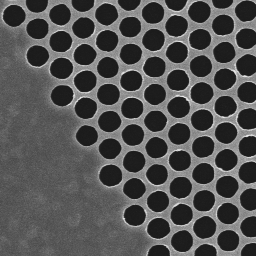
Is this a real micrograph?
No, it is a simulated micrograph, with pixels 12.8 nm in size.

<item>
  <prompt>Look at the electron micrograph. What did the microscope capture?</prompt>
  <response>a regular array of holes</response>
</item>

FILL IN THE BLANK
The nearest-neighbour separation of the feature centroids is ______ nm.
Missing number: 340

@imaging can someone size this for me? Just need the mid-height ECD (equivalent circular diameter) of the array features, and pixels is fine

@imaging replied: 21.9